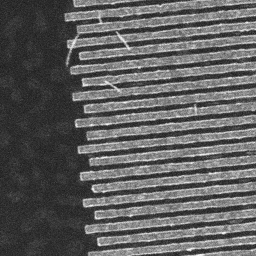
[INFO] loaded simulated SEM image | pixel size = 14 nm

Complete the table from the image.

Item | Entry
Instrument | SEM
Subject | parallel lines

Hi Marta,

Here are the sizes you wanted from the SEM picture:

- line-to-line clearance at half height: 80 nm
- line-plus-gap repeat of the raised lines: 0.186 microns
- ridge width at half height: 110 nanometres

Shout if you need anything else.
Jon